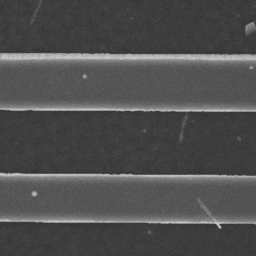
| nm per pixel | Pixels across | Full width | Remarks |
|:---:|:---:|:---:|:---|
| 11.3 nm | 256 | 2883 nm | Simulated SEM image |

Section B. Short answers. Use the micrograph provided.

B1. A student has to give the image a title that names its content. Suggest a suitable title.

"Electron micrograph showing lines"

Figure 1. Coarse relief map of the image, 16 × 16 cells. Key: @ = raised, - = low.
----------------
----------------
----------------
@@@@@@@-@-@-----
@@@@@@@@@@@@@@@@
@@@@@@@@@@@@@@@@
@@@@@@@@@@@@@@@@
----------------
----------------
----------------
----------------
@@@@@@@@@@@@@@@@
@@@@@@@@@@@@@@@@
@@@@@@@@@@@@@@@@
----------------
----------------